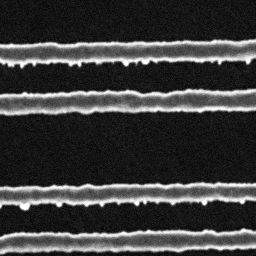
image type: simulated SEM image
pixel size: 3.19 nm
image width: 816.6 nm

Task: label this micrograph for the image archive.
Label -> lines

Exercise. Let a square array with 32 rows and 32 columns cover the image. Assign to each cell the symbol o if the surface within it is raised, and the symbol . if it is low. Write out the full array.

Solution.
................................
................................
................................
................................
................................
.....oo...oooooooooooooooooooooo
oooooooooooooooooooooooooooooooo
oooooooooooooooooooo.oo.oooo....
................................
................................
................................
..........oo.oooo.....oooooo.ooo
oooooooooooooooooooooooooooooooo
oooooooooooooooooooooooooooooooo
................................
................................
................................
................................
................................
................................
................................
................................
................................
oooooooooooooooooooooooooooooooo
oooooooooooooooooooooooooooooooo
o.oo...o.oo.....................
................................
................................
................................
.ooooooooooooooooooooooooooooooo
oooooooooooooooooooooooooooooooo
................................